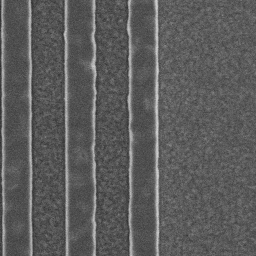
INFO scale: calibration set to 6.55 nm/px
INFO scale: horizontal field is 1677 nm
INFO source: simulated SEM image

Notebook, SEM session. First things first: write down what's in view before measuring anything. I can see one or a few lines or trenches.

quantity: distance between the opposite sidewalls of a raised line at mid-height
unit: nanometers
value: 192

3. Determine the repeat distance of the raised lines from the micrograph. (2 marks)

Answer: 416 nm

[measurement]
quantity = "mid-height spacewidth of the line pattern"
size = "227 nm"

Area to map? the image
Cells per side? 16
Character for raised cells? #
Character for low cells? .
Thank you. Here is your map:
##..##..##......
##..##..##......
##..##..##......
##..##..##......
##..##..##......
##..##..##......
##..##..##......
##..##..##......
##..##..##......
##..##..##......
##..##..##......
##..##..##......
##..##..##......
##..##..##......
##..##..##......
##..##..##......